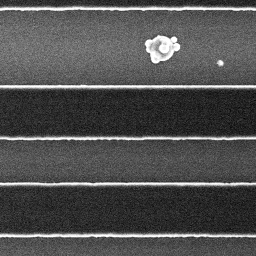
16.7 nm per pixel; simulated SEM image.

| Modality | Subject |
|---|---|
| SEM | lines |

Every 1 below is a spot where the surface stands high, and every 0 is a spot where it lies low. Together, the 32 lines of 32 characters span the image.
11111111111111111111111111111111
00000000000000000000000000000000
00000000000000000000000000000000
00000000000000000000000000000000
00000000000000000000000000000000
00000000000000000000000000000000
00000000000000000000000000000000
00000000000000000000000000000000
00000000000000000000000000000000
00000000000000000000000000000000
00000000000000000000000000000000
11111111111111111111111111111111
11111111111111111111111111111111
11111111111111111111111111111111
11111111111111111111111111111111
11111111111111111111111111111111
11111111111111111111111111111111
00000000000000000000000000000000
00000000000000000000000000000000
00000000000000000000000000000000
00000000000000000000000000000000
00000000000000000000000000000000
00000000000000000000000000000000
11111111111111111111111111111111
11111111111111111111111111111111
11111111111111111111111111111111
11111111111111111111111111111111
11111111111111111111111111111111
11111111111111111111111111111111
11111111111100111111011110111111
00000000000000000000000000000000
00000000000000000000000000000000